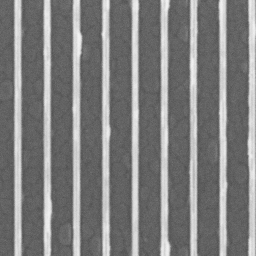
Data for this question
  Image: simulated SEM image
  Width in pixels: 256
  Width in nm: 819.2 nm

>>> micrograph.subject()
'parallel lines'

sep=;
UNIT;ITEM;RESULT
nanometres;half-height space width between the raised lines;75.7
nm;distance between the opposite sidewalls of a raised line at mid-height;18.8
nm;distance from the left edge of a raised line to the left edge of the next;93.7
